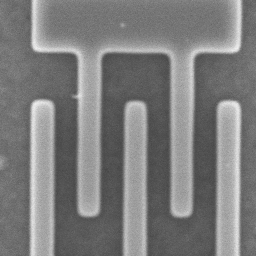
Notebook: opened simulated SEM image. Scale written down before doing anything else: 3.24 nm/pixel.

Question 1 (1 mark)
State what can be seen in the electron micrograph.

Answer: groups of lines, slits or small figures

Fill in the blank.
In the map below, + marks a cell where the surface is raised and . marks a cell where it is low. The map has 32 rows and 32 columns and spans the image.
....++++++++++++++++++++++++++..
....++++++++++++++++++++++++++..
....++++++++++++++++++++++++++..
....++++++++++++++++++++++++++..
....++++++++++++++++++++++++++..
....++++++++++++++++++++++++++..
.........++++.......+++++.......
..........+++........+++........
..........+++........+++........
..........+++........+++........
..........+++........+++........
..........++.........+++........
..........++.........+++........
....+++...++....++...+++...+++..
....+++...++....++...+++...+++..
....+++...++....++...+++...+++..
....+++...++....++...+++...+++..
....+++...++....++...+++...+++..
....+++...++....++...+++...+++..
....+++...++....++...+++...+++..
....+++...++....++...+++...+++..
....+++...++....++...+++...+++..
....+++...++....++...+++...+++..
....+++...++....++...+++...+++..
....+++...++....++...+++...+++..
....+++...++....++...+++...+++..
....+++...++....++....++...+++..
....+++.........++.........+++..
....+++.........++.........+++..
....+++.........++.........+++..
....++..........++.........+++..
....++..........++.........+++..